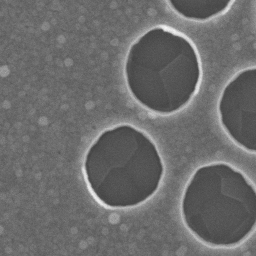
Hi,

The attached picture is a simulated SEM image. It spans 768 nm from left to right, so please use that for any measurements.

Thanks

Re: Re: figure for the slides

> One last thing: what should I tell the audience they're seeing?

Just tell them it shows holes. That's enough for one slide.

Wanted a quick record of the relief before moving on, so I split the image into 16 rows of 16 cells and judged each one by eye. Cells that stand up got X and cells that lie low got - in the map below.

XXXXXXXXXXX---XX
XXXXXXXXXXXXXXXX
XXXXXXXXX---XXXX
XXXXXXXX----XXXX
XXXXXXXX----XXX-
XXXXXXXX----XX--
XXXXXXXXX---XX--
XXXXXXXXXXXXXX--
XXXXXX---XXXXX--
XXXXXX----XXXXXX
XXXXX-----XXX-XX
XXXXXX----XX----
XXXXXX---XX-----
XXXXXXXXXXX-----
XXXXXXXXXXXX----
XXXXXXXXXXXXXXXX